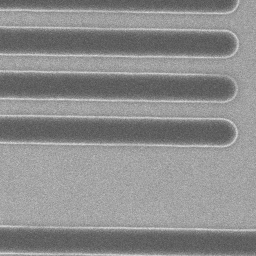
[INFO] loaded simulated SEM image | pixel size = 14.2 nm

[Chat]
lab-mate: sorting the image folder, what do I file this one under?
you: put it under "groups of lines, slits or small figures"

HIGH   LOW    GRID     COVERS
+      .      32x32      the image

++++++++++++++++++++++++++++++..
.................++++++++++++...
................................
+++++++.........................
+++++++++++++++++++++++++++++...
++++++++++++++++++++++++++++++..
+++++++++++++++++++++++++++++...
................................
................................
++++++++++++++++++++++++++++....
+++++++++++++++++++++++++++++...
++++++++++++++++++++++++++++++..
.............++++++++++++++++...
................................
+++++...........................
+++++++++++++++++++++++++++++...
++++++++++++++++++++++++++++++..
+++++++++++++++++++++++++++++...
................................
................................
................................
................................
................................
................................
................................
................................
................................
................................
++++++++++++++++................
++++++++++++++++++++++++++++++++
++++++++++++++++++++++++++++++++
++++++++++++++++++++++++++++++++